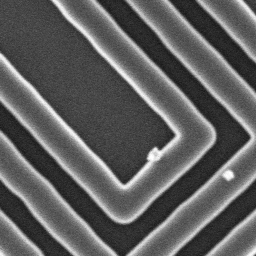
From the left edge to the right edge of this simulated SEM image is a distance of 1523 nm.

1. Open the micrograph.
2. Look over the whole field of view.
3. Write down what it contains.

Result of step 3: groups of lines, slits or small figures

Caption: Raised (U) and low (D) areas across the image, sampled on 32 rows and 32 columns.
DDDDDDDUUUUUDDDDUUUUUDDDDUUUUUDD
DDDDDDDDUUUUUDDDDUUUUUDDDDUUUUUD
DDDDDDDDDUUUUUDDDDUUUUUDDDDUUUUU
DDDDDDDDDDUUUUUDDDDUUUUUDDDDUUUU
DDDDDDDDDDDUUUUUDDDDUUUUUDDDDUUU
DDDDDDDDDDDDUUUUUDDDDUUUUUDDDDUU
DDDDDDDDDDDDDUUUUUDDDUUUUUUDDDDU
UDDDDDDDDDDDDDUUUUUDDDDUUUUUDDDD
UDDDDDDDDDDDDDDUUUUUDDDDUUUUUDDD
UUDDDDDDDDDDDDDDUUUUUDDDUUUUUUDD
UUUUDDDDDDDDDDDDDUUUUUDDDUUUUUUD
UUUUDDDDDDDDDDDDDUUUUUUDDDUUUUUU
UUUUUDDDDDDDDDDDDDUUUUUDDDDUUUUU
DUUUUUDDDDDDDDDDDDDUUUUUDDDDUUUU
DDUUUUUDDDDDDDDDDDDDUUUUUDDDDUUU
DDDUUUUUDDDDDDDDDDDDDUUUUUDDDDUU
DDDDUUUUUDDDDDDDDDDDDDUUUUUDDDDU
UDDDDUUUUUDDDDDDDDDDDDUUUUUDDDDU
UUDDDDUUUUUDDDDDDDDDDUUUUUDDDDUU
UUUDDDDUUUUUDDDDDDDUUUUUUDDDDUUU
UUUUDDDUUUUUUDDDDDUUUUUUDDDDUUUU
UUUUDDDDUUUUUUDDDDUUUUUDDDDUUUUU
UUUUUUDDDDUUUUUDDUUUUUDDDDUUUUUU
DUUUUUUDDDUUUUUUUUUUUDDDDUUUUUUD
DDUUUUUDDDDUUUUUUUUUDDDDUUUUUUDD
DDDUUUUUDDDDUUUUUUUDDDDUUUUUDDDD
DDDDUUUUUDDDDUUUUUDDDDUUUUUDDDDD
UDDDDUUUUUDDDDUUDDDDDUUUUUDDDDDU
UUDDDDUUUUUDDDDDDDDDUUUUUDDDDUUU
UUUDDDDUUUUUDDDDDDDUUUUUDDDDDUUU
UUUUDDDDUUUUUDDDDDUUUUUDDDDUUUUU
UUUUUDDDDUUUUUDDUUUUUUDDDDUUUUUU